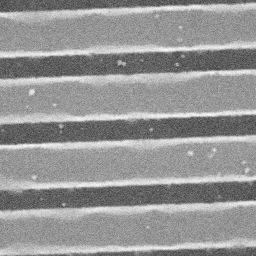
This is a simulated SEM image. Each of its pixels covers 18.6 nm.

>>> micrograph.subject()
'lines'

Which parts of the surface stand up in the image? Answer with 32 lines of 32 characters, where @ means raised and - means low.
--------------------------------
-----------@@@@@@@@@@@@@@@@@@@@@
@@@@@@@@@@@@@@@@@@@@@@@@@@@@@@@@
@@@@@@@@@@@@@@@@@@@@@@@@@@@@@@@@
@@@@@@@@@@@@@@@@@@@@@@@@@@@@@@@@
@@@@@@@@@@@@@@@@@@@@@@@@@@@@@@@@
@@@@@@@@@@----------------------
--------------------------------
--------------------------------
-----------------------@@@@@@@@@
@@@@@@@@@@@@@@@@@@@@@@@@@@@@@@@@
@@@@@@@@@@@@@@@@@@@@@@@@@@@@@@@@
@@@@@@@@@@@@@@@@@@@@@@@@@@@@@@@@
@@@@@@@@@@@@@@@@@@@@@@@@@@@@@@@@
@@@@@@@@@@@@@@@@@---------------
--------------------------------
--------------------------------
-----------------------@@@@@@@@@
@@@@@@@@@@@@@@@@@@@@@@@@@@@@@@@@
@@@@@@@@@@@@@@@@@@@@@@@@@@@@@@@@
@@@@@@@@@@@@@@@@@@@@@@@@@@@@@@@@
@@@@@@@@@@@@@@@@@@@@@@@@@@@@@@@@
@@@@@@@@@@@@@@@@@@@@@@@@@@------
--------------------------------
--------------------------------
-----------------------------@@@
----------@@@@@@@@@@@@@@@@@@@@@@
@@@@@@@@@@@@@@@@@@@@@@@@@@@@@@@@
@@@@@@@@@@@@@@@@@@@@@@@@@@@@@@@@
@@@@@@@@@@@@@@@@@@@@@@@@@@@@@@@@
@@@@@@@@@@@@@@@@@@@@@@@@@@@@@---
@-------------------------------